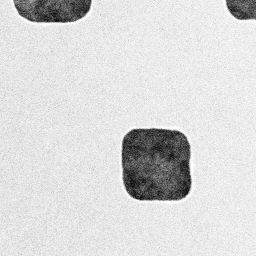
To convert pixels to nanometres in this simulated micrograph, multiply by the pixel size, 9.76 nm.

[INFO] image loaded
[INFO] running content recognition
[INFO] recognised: holes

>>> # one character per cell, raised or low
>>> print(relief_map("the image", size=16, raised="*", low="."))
*.....********..
****************
****************
****************
****************
****************
****************
****************
********....****
********....****
********....****
********....****
*********..*****
****************
****************
****************